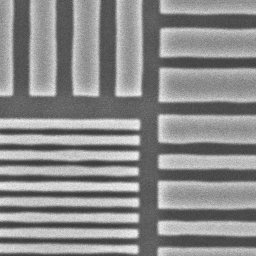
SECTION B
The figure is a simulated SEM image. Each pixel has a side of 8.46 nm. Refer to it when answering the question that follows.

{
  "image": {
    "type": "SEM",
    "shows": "groups of lines, slits or small figures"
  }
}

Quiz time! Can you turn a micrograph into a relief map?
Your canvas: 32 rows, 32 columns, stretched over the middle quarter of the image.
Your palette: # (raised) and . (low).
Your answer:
..#######....######.............
..#######....######.....########
..######.....######.....########
..######.....######.....########
..######.....######.....########
...#####.....######.....########
...#####.....######.....########
...#####.....######.....########
........................########
................................
................................
................................
................................
........................########
###################.....########
###################.....########
........................########
........................########
###################.....########
###################......#######
................................
................................
###################.............
##################......########
........................########
###.....................########
##################..............
##################..............
................................
........................#####...
##################......########
##################......########